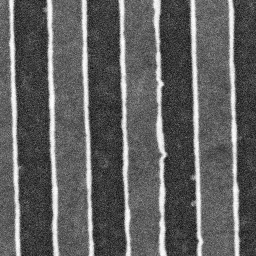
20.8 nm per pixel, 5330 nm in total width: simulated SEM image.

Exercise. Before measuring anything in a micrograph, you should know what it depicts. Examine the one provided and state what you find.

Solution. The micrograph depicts one or a few lines or trenches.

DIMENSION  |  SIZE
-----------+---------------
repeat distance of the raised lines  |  1.51 µm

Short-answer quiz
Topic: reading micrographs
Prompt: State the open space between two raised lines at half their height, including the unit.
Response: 36.4 px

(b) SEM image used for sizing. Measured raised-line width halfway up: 757 nanometres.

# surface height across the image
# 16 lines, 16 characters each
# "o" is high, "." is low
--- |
o..oo...oo..oo..
o..oo...oo..ooo.
o..oo...oo..ooo.
o..oo...oo..oo..
o..oo...oo..ooo.
o..oo...oo..ooo.
o..oo...oo..ooo.
o..oo...oo..ooo.
o..ooo..oo..ooo.
o..ooo..oo..ooo.
o..ooo..oo..ooo.
o..ooo..oo..ooo.
o..ooo..oo..ooo.
o..ooo..oo..ooo.
o..ooo..oo..ooo.
o..ooo..oo..ooo.